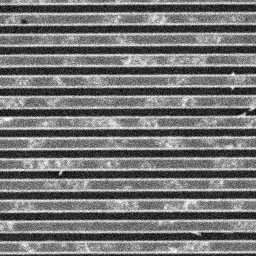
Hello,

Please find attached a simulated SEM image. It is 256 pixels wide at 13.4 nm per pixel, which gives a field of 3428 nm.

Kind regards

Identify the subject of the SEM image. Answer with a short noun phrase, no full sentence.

parallel lines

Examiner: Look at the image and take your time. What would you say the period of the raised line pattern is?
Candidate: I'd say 278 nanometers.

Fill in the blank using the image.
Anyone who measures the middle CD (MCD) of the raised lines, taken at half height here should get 161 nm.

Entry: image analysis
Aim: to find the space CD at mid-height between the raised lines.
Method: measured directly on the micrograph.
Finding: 9.38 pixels